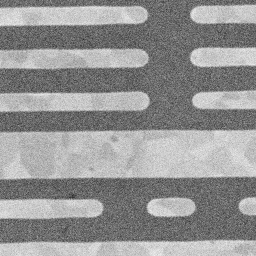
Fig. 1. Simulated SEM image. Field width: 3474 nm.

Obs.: groups of lines, slits or small figures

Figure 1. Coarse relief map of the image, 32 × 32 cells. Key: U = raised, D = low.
DDDDDDDDDDDDDDDDDDDDDDDDDDDDDDDD
UUUUUUUUUUUUUUUUUUDDDDDDUUUUUUUU
UUUUUUUUUUUUUUUUUUDDDDDDUUUUUUUU
DDDDDDDDDDDDDDDDDDDDDDDDDDDDDDDD
DDDDDDDDDDDDDDDDDDDDDDDDDDDDDDDD
DDDDDDDDDDDDDDDDDDDDDDDDDDDDDDDD
UUUUUUUUUUUUUUUUUUDDDDDDUUUUUUUU
UUUUUUUUUUUUUUUUUUDDDDDDUUUUUUUU
DDDDDDDDDDDDDDDDDDDDDDDDDDDDDDDD
DDDDDDDDDDDDDDDDDDDDDDDDDDDDDDDD
DDDDDDDDDDDDDDDDDDDDDDDDDDDDDDDD
DDDDDDDDDDDDDDDDDDDDDDDDDDDDDUUU
UUUUUUUUUUUUUUUUUUUDDDDDUUUUUUUU
UUUUUUUUUUUUUUUUUUDDDDDDDDDUUUDD
DDDDDDDDDDDDDDDDDDDDDDDDDDDDDDDD
DDDDDDDDDDDDDDDDDDDDDDDDDDDDDDDD
DDDDDDDDDDDUUUUUUUUUUUUUUUUUUUUU
UUUUUUUUUUUUUUUUUUUUUUUUUUUUUUUU
UUUUUUUUUUUUUUUUUUUUUUUUUUUUUUUU
UUUUUUUUUUUUUUUUUUUUUUUUUUUUUUUU
UUUUUUUUUUUUUUUUUUUUUUUUUUUUUUUU
UUUUUUUUUUUUUUUUUUUUUUUUUUUUUUUU
DDDDDDDDDDDDDDDDDDDDDDDDDDDDDDDD
DDDDDDDDDDDDDDDDDDDDDDDDDDDDDDDD
DDDDDDDDDDDDDDDDDDDDDDDDDDDDDDDD
UUUUUUUUUUUUUDDDDDDUUUUUDDDDDDUU
UUUUUUUUUUUUUDDDDDDUUUUUDDDDDDUU
DDDDDDDDDDDDDDDDDDDDDDDDDDDDDDDD
DDDDDDDDDDDDDDDDDDDDDDDDDDDDDDDD
DDDDDDDDDDDDDDDDDDDDDDDDDDDDDDDD
DDUUUUUUUUUUUUUUUUUUUUUUUUUUUUUU
UUUUUUUUUUUUUUUUUUUUUUUUUUUUUUUU